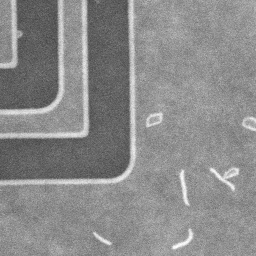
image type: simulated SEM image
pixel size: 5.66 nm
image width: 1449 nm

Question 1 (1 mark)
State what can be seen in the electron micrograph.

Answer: groups of lines, slits or small figures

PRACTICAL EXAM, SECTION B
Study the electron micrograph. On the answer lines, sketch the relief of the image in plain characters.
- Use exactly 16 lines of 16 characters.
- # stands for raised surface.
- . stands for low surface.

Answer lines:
#...#...########
#...#...########
#...#...########
#...#...########
....#...########
....#...########
...##...########
#####...########
####....########
........########
........########
################
################
################
################
################